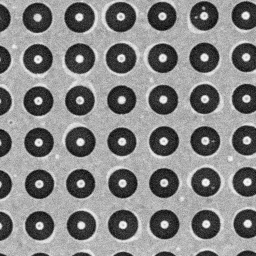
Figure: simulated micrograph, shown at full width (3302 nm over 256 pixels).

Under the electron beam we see an array of small figures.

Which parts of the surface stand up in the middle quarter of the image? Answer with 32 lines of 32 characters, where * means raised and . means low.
.......****.......***.......****
*......****......*****.....*****
**....*******...****************
********************************
********************************
**.....******...*******...******
*......*****.....****.......****
*.......***.......***.......***.
...*....***.......***........**.
...**...***...*...***........**.
........***.......***.......****
*......*****.....*****......****
**....*******...********..******
********************************
********************************
**...*******************..******
*.....******.....*****......****
........***.......****......****
........***.......***........***
...**...***...*...***...*....**.
........***.......***........***
*......****.......****......****
**.....*****.....******....*****
**************.*****************
********************************
********************************
***..*******....*******....*****
*......****.......****......****
*.......***.......***........**.
....*...***...*...***...**...**.
........***.......***........***
*......****.......***........***